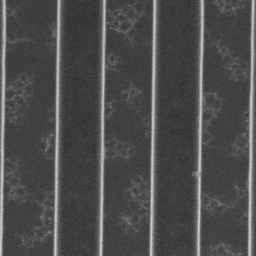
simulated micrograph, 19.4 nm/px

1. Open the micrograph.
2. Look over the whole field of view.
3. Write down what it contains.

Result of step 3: one or a few lines or trenches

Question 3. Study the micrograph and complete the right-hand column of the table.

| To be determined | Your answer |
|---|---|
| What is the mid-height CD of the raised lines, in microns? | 0.98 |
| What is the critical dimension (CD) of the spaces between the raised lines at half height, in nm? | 900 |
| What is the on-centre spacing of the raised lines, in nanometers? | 1900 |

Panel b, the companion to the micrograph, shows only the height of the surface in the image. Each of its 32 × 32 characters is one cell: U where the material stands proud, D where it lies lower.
DUUUUUUDDDDDDUUUUUUDDDDDDUUUUUUU
DUUUUUUDDDDDDUUUUUUDDDDDDUUUUUUU
DUUUUUUDDDDDDUUUUUUDDDDDDUUUUUUU
DUUUUUUDDDDDDUUUUUUDDDDDDUUUUUUU
DUUUUUUDDDDDDUUUUUUDDDDDDUUUUUUD
DUUUUUUDDDDDDUUUUUUDDDDDDUUUUUUD
UUUUUUUDDDDDDUUUUUUDDDDDDUUUUUUD
UUUUUUUDDDDDDUUUUUUDDDDDDUUUUUUD
UUUUUUUDDDDDDUUUUUUDDDDDDUUUUUUD
UUUUUUUDDDDDDUUUUUUDDDDDDUUUUUUD
DUUUUUUDDDDDDUUUUUUDDDDDDUUUUUUD
UUUUUUUDDDDDDUUUUUUDDDDDDUUUUUUD
UUUUUUUDDDDDDUUUUUUDDDDDDUUUUUUD
UUUUUUUDDDDDDUUUUUUDDDDDDUUUUUUD
UUUUUUUDDDDDDUUUUUUDDDDDDUUUUUUD
UUUUUUUDDDDDDUUUUUUDDDDDDUUUUUUD
UUUUUUUDDDDDDUUUUUUDDDDDDUUUUUUD
UUUUUUUDDDDDDUUUUUUDDDDDDUUUUUUD
UUUUUUUDDDDDDUUUUUUDDDDDDUUUUUUD
UUUUUUUDDDDDDUUUUUUDDDDDDUUUUUUD
UUUUUUUDDDDDDUUUUUUDDDDDDUUUUUUD
UUUUUUUDDDDDDUUUUUUDDDDDDUUUUUUD
UUUUUUUDDDDDDUUUUUUDDDDDDUUUUUUD
UUUUUUUDDDDDDUUUUUUDDDDDDUUUUUUD
UUUUUUUDDDDDDUUUUUUDDDDDDUUUUUUD
UUUUUUUDDDDDDUUUUUUDDDDDDUUUUUUD
UUUUUUUDDDDDDUUUUUUDDDDDDUUUUUUD
UUUUUUUDDDDDDUUUUUUDDDDDDUUUUUUD
UUUUUUUDDDDDDUUUUUUDDDDDDUUUUUUD
UUUUUUUDDDDDDUUUUUUDDDDDDUUUUUUD
UUUUUUUDDDDDDUUUUUUDDDDDDUUUUUUD
UUUUUUUDDDDDDUUUUUUDDDDDDUUUUUUD